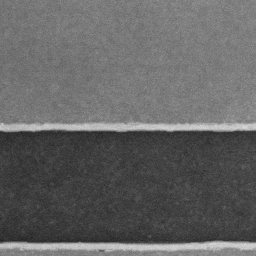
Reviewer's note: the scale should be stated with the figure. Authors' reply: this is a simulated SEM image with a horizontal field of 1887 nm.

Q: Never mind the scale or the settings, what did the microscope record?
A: one or a few lines or trenches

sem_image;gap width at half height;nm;878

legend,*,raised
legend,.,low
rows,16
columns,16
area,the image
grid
****************
****************
****************
****************
****************
****************
****************
****************
................
................
................
................
................
................
................
****************